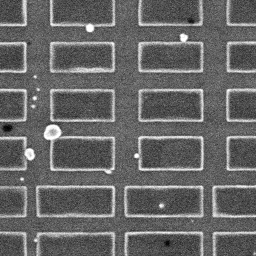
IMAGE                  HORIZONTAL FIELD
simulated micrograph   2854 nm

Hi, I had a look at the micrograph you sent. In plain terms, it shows wiring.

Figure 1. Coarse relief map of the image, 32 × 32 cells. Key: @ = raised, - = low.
@@@---@@@@@@@@----@@@@@@@----@@@
@@@---@@@@@@@@---@@@@@@@@---@@@@
@@@---@@@@@@@@---@@@@@@@@---@@@@
-----------@--------------------
--------------------------------
@@@----@@@@@@@----@@@@@@@----@@-
@@@---@@@@@@@@---@@@@@@@@----@@@
@@@---@@@@@@@@---@@@-@@@@----@@@
@@@---@@@@@@@@---@@@-@@@@----@@@
--------------------------------
--------------------------------
@@@----@@@@@@@----@@@@@@@---@@@@
@@@---@@@@@@@@----@@@@@@@---@@@@
@@@---@@@@@@@@----@@@@@@@---@@@@
@@@---@@@@@@@@---@@@@@@@@---@@@@
--------------------------------
------@@------------------------
@@@---@@@@@@@@---@@@@@@@@---@@@@
@@@---@@@@@@@@---@@@@@@@@---@@@@
@@@@--@@@@@@@@---@@@@@@@@---@@@@
@@@---@@@@@@@@---@@@@@@@@---@@@@
--------------------------------
--------------------------------
@@@--@@@@@@@@@--@@@@@@@@@--@@@@@
@@@--@@@@@@@@@--@@@@@@@@@--@@@@@
@@@--@@@@@@@@@--@@@@@@@@@--@@@@@
@@@--@@@@@@@@@--@@@@@@@@@--@@@@@
--------------------------------
--------------------------------
@@@--@@@@@@@@@--@@@@@@@@@--@@@@@
@@@--@@@@@@@@@--@@@@@@@@@--@@@@@
@@@--@@@@@@@@@--@@@@@@@@@--@@@@@